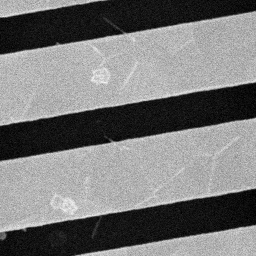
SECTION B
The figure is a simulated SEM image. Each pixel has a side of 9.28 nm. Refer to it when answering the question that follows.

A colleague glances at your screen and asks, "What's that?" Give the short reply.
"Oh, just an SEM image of lines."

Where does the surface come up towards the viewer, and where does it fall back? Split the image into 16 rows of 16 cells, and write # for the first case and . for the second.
####............
...........#####
......##########
################
################
##############..
########........
##.............#
.........#######
....############
################
################
############....
######..........
..............##
........########